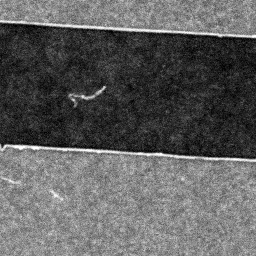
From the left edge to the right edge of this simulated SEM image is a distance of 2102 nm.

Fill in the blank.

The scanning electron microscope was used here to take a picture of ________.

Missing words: one or a few lines or trenches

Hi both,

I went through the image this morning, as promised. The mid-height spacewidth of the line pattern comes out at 1010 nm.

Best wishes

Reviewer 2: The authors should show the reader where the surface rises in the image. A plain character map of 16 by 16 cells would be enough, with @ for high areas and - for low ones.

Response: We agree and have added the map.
@@@@@@@@@@@@@@@@
--@@@@@@@@@@@@@@
----------------
----------------
----------------
----------------
----------------
----------------
----------------
@@@@@@@---------
@@@@@@@@@@@@@@@@
@@@@@@@@@@@@@@@@
@@@@@@@@@@@@@@@@
@@@@@@@@@@@@@@@@
@@@@@@@@@@@@@@@@
@@@@@@@@@@@@@@@@